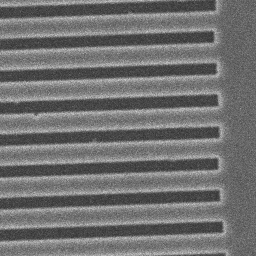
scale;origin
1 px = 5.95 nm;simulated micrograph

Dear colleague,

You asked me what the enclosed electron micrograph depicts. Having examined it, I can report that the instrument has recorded parallel lines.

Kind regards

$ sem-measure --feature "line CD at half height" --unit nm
113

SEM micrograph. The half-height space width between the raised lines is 75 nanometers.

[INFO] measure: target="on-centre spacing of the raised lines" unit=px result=31.7